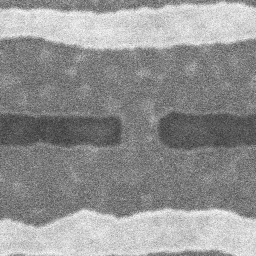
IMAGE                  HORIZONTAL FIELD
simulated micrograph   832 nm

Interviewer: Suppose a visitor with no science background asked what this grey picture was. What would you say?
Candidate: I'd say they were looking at one or a few lines or trenches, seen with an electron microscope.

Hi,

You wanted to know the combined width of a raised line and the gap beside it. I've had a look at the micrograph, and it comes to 340 nm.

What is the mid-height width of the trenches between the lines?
225 nanometres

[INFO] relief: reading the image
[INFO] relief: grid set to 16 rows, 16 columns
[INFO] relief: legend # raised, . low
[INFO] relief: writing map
..........######
################
...############.
................
................
................
................
########..######
########..######
................
................
................
................
....###.#######.
################
################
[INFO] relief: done